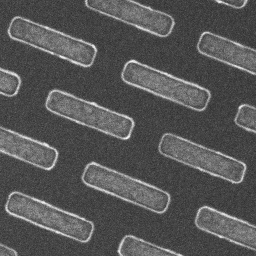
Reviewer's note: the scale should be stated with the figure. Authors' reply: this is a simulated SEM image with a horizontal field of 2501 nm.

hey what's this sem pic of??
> holes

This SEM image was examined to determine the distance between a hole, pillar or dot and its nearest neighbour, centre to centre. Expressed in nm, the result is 797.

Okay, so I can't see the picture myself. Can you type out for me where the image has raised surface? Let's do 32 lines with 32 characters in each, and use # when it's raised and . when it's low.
###########......###########..##
#############.......############
##.############......###########
#.....############...###########
##......#################..#####
####.......##############.....##
######......#############.......
#########...################....
################...###########..
..#############......###########
..###############.......########
..#################.......######
######....############....######
######.......###########.#####..
########.......###############..
###########......#############..
.############...################
....################...#########
......##############......######
##.....##############.......####
####...#################......##
###########...############....##
###########......############.##
############.......#############
#..############......###########
#.....###########....###########
#.......#################..#####
###........##############.....##
######......#############.......
#########..#################....
###############....###########..
..#############......###########